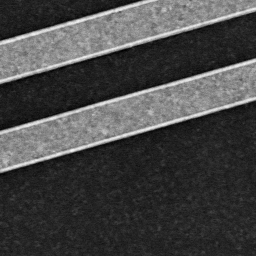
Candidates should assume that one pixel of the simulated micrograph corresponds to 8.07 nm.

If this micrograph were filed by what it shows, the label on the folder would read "one or a few lines or trenches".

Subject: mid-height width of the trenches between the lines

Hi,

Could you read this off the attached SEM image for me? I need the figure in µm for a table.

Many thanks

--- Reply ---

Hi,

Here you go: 0.407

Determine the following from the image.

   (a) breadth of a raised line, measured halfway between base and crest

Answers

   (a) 0.291 microns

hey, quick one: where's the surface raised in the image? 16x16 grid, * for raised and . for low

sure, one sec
........********
....********....
.********.......
*****...........
**...........***
..........******
......*********.
...********.....
********........
****............
*...............
................
................
................
................
................